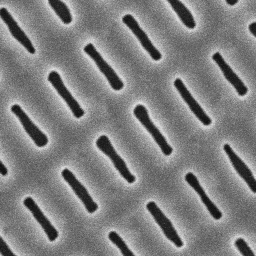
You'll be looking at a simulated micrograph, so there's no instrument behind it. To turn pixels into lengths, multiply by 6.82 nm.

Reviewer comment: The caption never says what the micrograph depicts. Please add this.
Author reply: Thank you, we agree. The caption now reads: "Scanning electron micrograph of a regular array of holes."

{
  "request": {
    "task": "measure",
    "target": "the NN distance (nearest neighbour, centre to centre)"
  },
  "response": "0.325 microns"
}